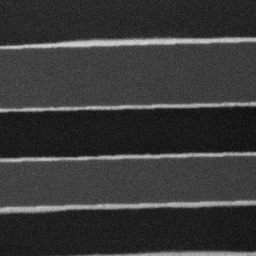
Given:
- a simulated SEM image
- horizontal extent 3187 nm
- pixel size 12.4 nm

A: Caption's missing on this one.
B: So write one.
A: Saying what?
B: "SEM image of lines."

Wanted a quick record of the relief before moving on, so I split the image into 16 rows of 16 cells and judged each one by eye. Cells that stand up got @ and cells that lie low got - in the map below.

----------------
----------------
----------------
@@@@@@@@@@@@@@@@
@@@@@@@@@@@@@@@@
@@@@@@@@@@@@@@@@
@@@@@@@@@@@@@@@@
----------------
----------------
----------------
@@@@@@@@@@@@@@@@
@@@@@@@@@@@@@@@@
@@@@@@@@@@@@@@@@
----------------
----------------
----------------